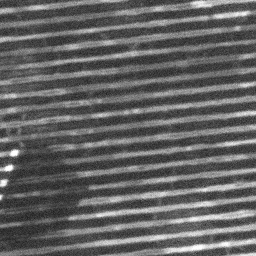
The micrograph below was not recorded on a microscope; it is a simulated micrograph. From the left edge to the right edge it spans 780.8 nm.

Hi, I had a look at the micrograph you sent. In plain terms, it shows parallel lines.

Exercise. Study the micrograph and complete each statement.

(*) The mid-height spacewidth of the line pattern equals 30.7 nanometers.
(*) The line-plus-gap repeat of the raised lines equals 43.3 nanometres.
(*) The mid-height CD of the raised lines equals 0.014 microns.